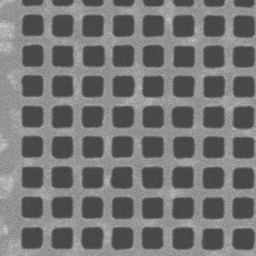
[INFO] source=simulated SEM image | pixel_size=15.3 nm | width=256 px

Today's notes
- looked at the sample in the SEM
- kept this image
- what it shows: a regular array of holes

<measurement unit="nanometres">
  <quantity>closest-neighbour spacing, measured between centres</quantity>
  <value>457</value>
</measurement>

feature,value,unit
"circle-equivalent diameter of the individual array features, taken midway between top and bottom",0.373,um